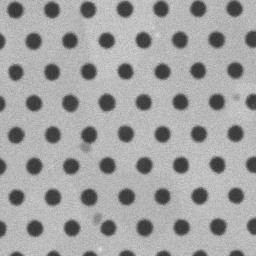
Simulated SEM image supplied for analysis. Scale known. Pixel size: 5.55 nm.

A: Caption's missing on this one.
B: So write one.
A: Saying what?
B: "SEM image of a regular array of holes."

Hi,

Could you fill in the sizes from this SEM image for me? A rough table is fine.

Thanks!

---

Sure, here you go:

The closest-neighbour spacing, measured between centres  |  199 nm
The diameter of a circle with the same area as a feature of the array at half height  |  95 nanometers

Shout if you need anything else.